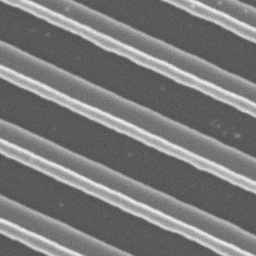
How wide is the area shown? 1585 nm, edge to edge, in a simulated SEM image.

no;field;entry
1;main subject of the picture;lines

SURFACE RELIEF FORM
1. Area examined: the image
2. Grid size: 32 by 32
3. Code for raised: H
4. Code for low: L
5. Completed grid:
LHHHHHHHHHLLLLLLLLLLLLHHHHHHHHHL
LLLLHHHHHHHHLLLLLLLLLLLLHHHHHHHH
LLLLLLHHHHHHHHLLLLLLLLLLLLHHHHHH
LLLLLLLLHHHHHHHHLLLLLLLLLLLLHHHH
LLLLLLLLLLHHHHHHHHHLLLLLLLLLLLHH
HLLLLLLLLLLLHHHHHHHHHLLLLLLLLLLL
HHHLLLLLLLLLLLHHHHHHHHHLLLLLLLLL
HHHHHLLLLLLLLLLLHHHHHHHHHLLLLLLL
HHHHHHHLLLLLLLLLLLLHHHHHHHHLLLLL
HHHHHHHHHLLLLLLLLLLLLHHHHHHHHHLL
LLHHHHHHHHHLLLLLLLLLLLLHHHHHHHHH
LLLLHHHHHHHHHHLLLLLLLLLLLHHHHHHH
LLLLLLHHHHHHHHHHLLLLLLLLLLLHHHHH
LLLLLLLLLHHHHHHHHHLLLLLLLLLLLLHH
LLLLLLLLLLLHHHHHHHHHLLLLLLLLLLLL
HLLLLLLLLLLLLHHHHHHHHHLLLLLLLLLL
HHHLLLLLLLLLLLLHHHHHHHHHHLLLLLLL
HHHHHHLLLLLLLLLLLHHHHHHHHHHLLLLL
HHHHHHHHLLLLLLLLLLLHHHHHHHHHHLLL
LHHHHHHHHHLLLLLLLLLLLLHHHHHHHHHL
LLLHHHHHHHHHLLLLLLLLLLLLHHHHHHHH
LLLLLHHHHHHHHHHLLLLLLLLLLLHHHHHH
LLLLLLLHHHHHHHHHHLLLLLLLLLLLHHHH
LLLLLLLLLLHHHHHHHHHLLLLLLLLLLLHH
LLLLLLLLLLLLHHHHHHHHHLLLLLLLLLLL
HHLLLLLLLLLLLLHHHHHHHHHLLLLLLLLL
HHHHHLLLLLLLLLLLHHHHHHHHHHLLLLLL
HHHHHHHLLLLLLLLLLLHHHHHHHHHHLLLL
HHHHHHHHHLLLLLLLLLLLHHHHHHHHHHLL
LHHHHHHHHHHLLLLLLLLLLLLHHHHHHHHH
LLLHHHHHHHHHHLLLLLLLLLLLLHHHHHHH
LLLLLHHHHHHHHHHHLLLLLLLLLLLHHHHH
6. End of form